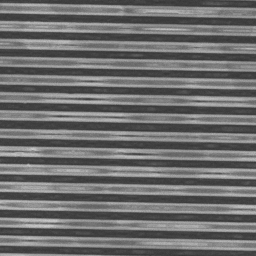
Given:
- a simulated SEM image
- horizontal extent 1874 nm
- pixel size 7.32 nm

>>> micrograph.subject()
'parallel lines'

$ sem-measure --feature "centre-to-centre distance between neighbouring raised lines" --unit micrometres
0.131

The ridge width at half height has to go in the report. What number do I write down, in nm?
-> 62.2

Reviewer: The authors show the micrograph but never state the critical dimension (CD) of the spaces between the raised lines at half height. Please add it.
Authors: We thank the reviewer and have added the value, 0.0677 µm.